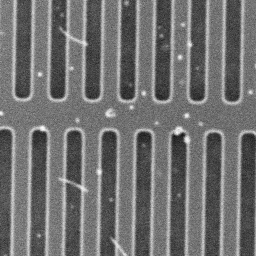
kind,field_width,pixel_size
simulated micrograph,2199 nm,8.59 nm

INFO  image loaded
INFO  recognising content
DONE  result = groups of lines, slits or small figures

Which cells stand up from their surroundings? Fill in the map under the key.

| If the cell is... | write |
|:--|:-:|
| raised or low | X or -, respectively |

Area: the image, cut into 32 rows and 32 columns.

XX--XX--XXX--XX--XX---XX--XX--XX
XX--XX--XXX--XX--XX---XX--XX--XX
XX--XX--XXX--XX--XX---XX--XX--XX
XX--XX--XXX--XX--XX---XX--XX--XX
XX--XX--XXX--XX--XX---XX--XX--XX
XX--XX--XXX--XX--XX--XXX--XX--XX
XX--XX--XXX--XX--XX--XXX--XX--XX
XX--XX--XXX--XX--XX--XXX--XX--XX
XX--XX--XXX--XX--XX--XXX--XX--XX
XX--XX--XX---XX--XX--XXX--XX--XX
XX--XX--XX---XX--XX--XXX--XX--XX
XX--XX--XXX--XX--XX--XXX--XX--XX
XXXXXXXXXXX-XXX-XXXX-XXX-XXX--XX
XXXXXXXXXXXXXXXXXXXXXXXXXXXXXXXX
XXXXXXXXXXXXXXXXXXXXXXXXXXXXXXXX
XXXXXXXXXXXXXXXXXXXXXXXXXXXXXXXX
-XXX--XX--XXX-XXX--XXXXXXX-XXXXX
--XX--XX--XXX--XX--XX--XXX--XX--
--XX--XX--XXX--XX--XX--XXX--XX--
--XX--XX--XXX--XX--XX--XXX--XX--
--XX--XX--XXX--XX--XX--XXX--XX--
--XX--XX--XXX--XX--XX--XXX--XX--
--XX--XX--XX---XX--XX--XX---XX--
--XX--XX--XX---XX--XX--XX---XX--
--XX--XX--XX---XX--XX--XX---XX--
--XX--XX--XX---XX--XX--XX---XX--
--XX--XX--XX---XX--XX--XX---XX--
--XX--XX--XX---XX--XX--XX---XX--
--XX--XX--XX---XX--XX--XX---XX--
--XX--XX--XX---XX--XX--XX---XX--
--XX--XX--XX--XXX--XX--XX---XX--
--XX--XX--XX--XXX--XX--XX---XX--